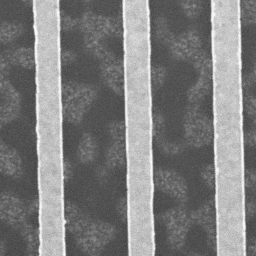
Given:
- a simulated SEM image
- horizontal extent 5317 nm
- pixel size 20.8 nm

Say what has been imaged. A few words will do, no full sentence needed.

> one or a few lines or trenches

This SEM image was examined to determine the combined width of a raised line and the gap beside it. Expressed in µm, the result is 1.86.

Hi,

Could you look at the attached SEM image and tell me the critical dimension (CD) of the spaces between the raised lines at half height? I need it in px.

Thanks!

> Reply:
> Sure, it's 65.1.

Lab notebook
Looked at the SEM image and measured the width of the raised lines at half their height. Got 511 nm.